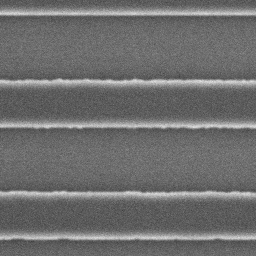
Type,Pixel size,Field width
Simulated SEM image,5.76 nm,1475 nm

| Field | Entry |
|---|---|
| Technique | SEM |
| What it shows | lines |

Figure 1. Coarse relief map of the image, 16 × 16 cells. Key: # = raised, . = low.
################
................
................
................
................
################
################
################
................
................
................
................
################
################
################
................